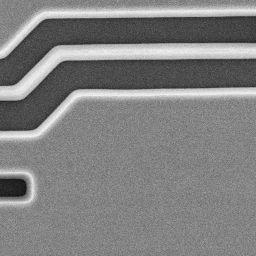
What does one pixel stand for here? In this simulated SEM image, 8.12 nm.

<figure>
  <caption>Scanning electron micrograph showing groups of lines, slits or small figures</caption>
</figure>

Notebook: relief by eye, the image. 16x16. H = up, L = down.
HHHHHHHHHHHHHHHH
HHLLLLLLLLLLLLLL
HLLLLLLLLLLLLLLL
LLLHHHHLLLLLLLLL
LLHLLLLLLLLLLLLL
LHLLLLLLLLLLLLLL
LLLLHHHHHHHHHHHH
LLLHHHHHHHHHHHHH
HHHHHHHHHHHHHHHH
HHHHHHHHHHHHHHHH
HHHHHHHHHHHHHHHH
LLHHHHHHHHHHHHHH
LHHHHHHHHHHHHHHH
HHHHHHHHHHHHHHHH
HHHHHHHHHHHHHHHH
HHHHHHHHHHHHHHHH